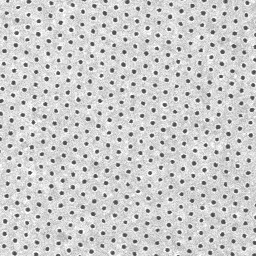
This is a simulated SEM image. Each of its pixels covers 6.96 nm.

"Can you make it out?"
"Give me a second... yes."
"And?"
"a regular array of holes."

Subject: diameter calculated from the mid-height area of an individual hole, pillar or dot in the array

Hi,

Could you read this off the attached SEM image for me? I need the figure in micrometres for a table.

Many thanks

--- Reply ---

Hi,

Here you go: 0.0304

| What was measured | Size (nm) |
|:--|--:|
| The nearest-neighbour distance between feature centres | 84.7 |